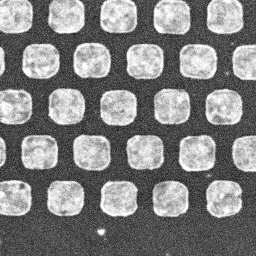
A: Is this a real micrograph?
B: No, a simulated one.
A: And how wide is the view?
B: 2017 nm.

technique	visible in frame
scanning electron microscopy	a regular array of raised bodies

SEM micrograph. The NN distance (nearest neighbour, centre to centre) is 407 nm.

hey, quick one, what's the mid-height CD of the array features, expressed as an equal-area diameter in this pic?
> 288 nanometres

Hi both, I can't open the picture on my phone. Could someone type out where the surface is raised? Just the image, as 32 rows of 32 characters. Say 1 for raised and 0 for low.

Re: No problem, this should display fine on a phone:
11110011110001111000111000111100
11110011110001111001111100111100
11110011110001111001111100111100
11110011110001111000111100111100
00000000000000000000000000000000
00000000000000000000000000000000
00011110001111001111000111100111
10011110011111001111000111100111
00011110011111001111000111100111
00001100001110000111000111000011
00000000000000000000000000000000
11100001110000010000111000011000
11110011110001111001111100111100
11110011111001111001111100111100
11110011110001111001111100111100
00000000100000110000000000000000
00000000000000000000000000000000
00011110001110001111000111000011
10011110011111001111000111100111
10011110011111001111000111100111
00011110001110001111000111100111
00000000000000000000000000000000
00000000000000000000000000000000
11110011110001111001111000111100
11110011110001111001111000111100
11110011110001111001111000111100
11100001110001111000111000111100
00000000000000000000000000000000
00000000000000000000000000000000
00000000000000000000000000000000
00000000000000000000000000000000
00000000000000000000000000000000